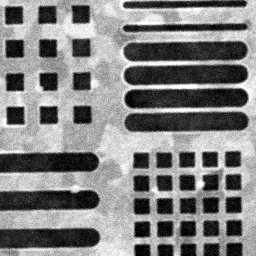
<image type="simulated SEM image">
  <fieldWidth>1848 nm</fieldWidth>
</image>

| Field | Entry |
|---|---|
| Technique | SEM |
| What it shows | groups of lines, slits or small figures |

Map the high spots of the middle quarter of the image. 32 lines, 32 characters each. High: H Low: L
HHHHHHHHHHHHHHHHLLLLLLLLLLLLLLLL
HHHHHHHHHHHHHHHLLLLLLLLLLLLLLLLL
HHLLLLLHHHHHHHHLLLLLLLLLLLLLLLLL
HHLLLLLHHHHHHHHLLLLLLLLLLLLLLLLL
HHLLLLLHHHHHHHHLLLLLLLLLLLLLLLLL
HHLLLLLHHHHHHHHHHLLLLLLLLLLLLLLH
HHLLLLHHHHHHHHHHLLLLLLLLLLLLLLLL
HHHHHHHHHHHHHHHLLLLLLLLLLLLLLLLL
HHHHHHHHHHHHHHHLLLLLLLLLLLLLLLLL
HHHHHHHHHHHHHHHLLLLLLLLLLLLLLLLL
HHLLLLLHHHHHHHHLLLLLLLLLLLLLLLLL
HHLLLLLHHHHHHHHHHLLHHHHHHLLLLLLL
HHLLLLLHHHHHHHHHLLLLLLLLLLLLLLLL
HHLLLLLHHHHHHHHLLLLLLLLLLLLLLLLL
HHLLLLLHHHHHHHHLLLLLLLLLLLLLLLLL
HHHHHHHHHHHHHHHLLLLLLLLLLLLLLLLL
HHHHHHHHHHHHHHHHLLLLLLLLLLLLLLLL
HHHHHHHHHHHHHHHHHHHHHHHHHHHHHHHH
HHHHHHHHHHHHHHHHHHHHHHHHHHHHHHHH
HHHHHHHHHHHHHHHHHHHHHHHHHHHHHHHH
HHHHHHHHHHHHHHHHHHHHHHHHHHHHHHHH
HHHHHHHHHHHHHHHHHHHHHHHHHHHHHHHH
LLLLLLLLHHHHHHHHHLLLLHHLLLLHHLLL
LLLLLLLLLHHHHHHHHLLLLHHLLLLHHLLL
LLLLLLLLLHHHHHHHHLLLLHHLLLLHHLLL
LLLLLLLLLHHHHHHHHLLLLHHLLLLHHLLL
LLLLLLLLHHHHHHHHHHHHHHHHHHHHHHHH
HHHHHHHHHHHHHHHHHHHHHHHHHHHHHHHH
HHHHHHHHHHHHHHHHHLLLLLHLLLLHHLLL
HHHHHHHHHHHHHHHHHLLLLLHLLLLHHLLL
HHHHHHHHHHHHHHHHHLLLLLHLLLLHHLLL
LLHHLLLLHHHHHHHHHLLLLLHHLLLHHLLL